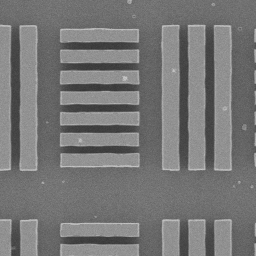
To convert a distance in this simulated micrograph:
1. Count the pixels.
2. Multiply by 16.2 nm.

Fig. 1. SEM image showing groups of lines, slits or small figures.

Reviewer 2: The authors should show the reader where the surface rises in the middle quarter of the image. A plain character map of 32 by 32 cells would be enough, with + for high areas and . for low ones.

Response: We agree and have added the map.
.........................++++..+
.........................++++..+
++++++++++++++++++.......++++..+
++++++++++++++++++.......++++..+
+++++++++++++++++++......++++..+
.........................++++..+
.........................++++..+
++++++++++++++++++.......++++..+
++++++++++++++++++.......++++..+
++++++++++++++++++.......++++..+
.........................++++..+
.........................++++..+
+++++++++++++++++++......++++..+
+++++++++++++++++++......++++..+
+++++++++++++++++++......++++..+
.........................++++..+
.........................++++..+
++++++++++++++++++.......++++..+
++++++++++++++++++.......++++..+
++++++++++++++++++.......++++..+
...+++..++...............+++...+
.........................+++...+
++++++++++++++++++.......++++..+
+++++++++++++++++++......++++..+
+++++++++++++++++++......++++..+
++++++++++...++.++.......++++..+
................................
................................
................................
................................
................................
................................